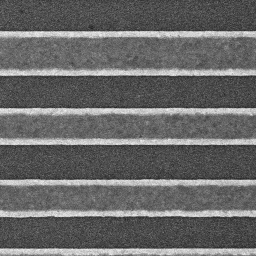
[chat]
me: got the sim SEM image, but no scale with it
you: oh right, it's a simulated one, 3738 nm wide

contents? one or a few lines or trenches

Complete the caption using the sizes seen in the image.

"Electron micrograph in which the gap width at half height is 0.551 µm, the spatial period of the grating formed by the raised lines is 1.06 um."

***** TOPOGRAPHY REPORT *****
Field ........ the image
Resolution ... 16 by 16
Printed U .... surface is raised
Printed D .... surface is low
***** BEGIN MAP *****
DDDDDDDDDDDDDDDD
DDDDDDDDDDDDDDDD
UUUUUUUUUUUUUUUU
UUUUUUUUUUUUUUUU
UUUUUUUUUUUUUUUU
DDDDDDDDDDDDDDDD
DDDDDDDDDDDDDDDD
UUUUUUUUUUUUUUUU
UUUUUUUUUUUUUUUU
DDDDDDDDDDDDDDDD
DDDDDDDDDDDDDDDD
UUUUUUUUUUUUUUUU
UUUUUUUUUUUUUUUU
DDDDDDDDDDDDDDDD
DDDDDDDDDDDDDDDD
DDDDDDDDDDDDDDDD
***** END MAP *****